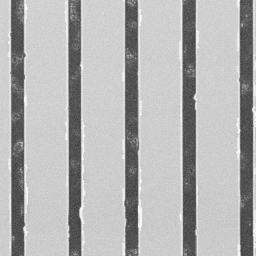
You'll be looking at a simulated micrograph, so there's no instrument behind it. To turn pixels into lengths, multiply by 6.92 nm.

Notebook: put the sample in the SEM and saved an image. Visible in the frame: parallel lines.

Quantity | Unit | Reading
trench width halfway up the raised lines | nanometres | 100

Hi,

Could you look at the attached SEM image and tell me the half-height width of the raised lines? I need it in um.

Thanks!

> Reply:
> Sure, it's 0.294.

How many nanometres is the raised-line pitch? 396